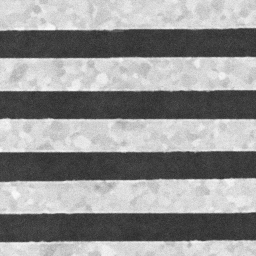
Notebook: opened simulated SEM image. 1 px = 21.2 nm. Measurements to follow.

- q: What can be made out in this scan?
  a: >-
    lines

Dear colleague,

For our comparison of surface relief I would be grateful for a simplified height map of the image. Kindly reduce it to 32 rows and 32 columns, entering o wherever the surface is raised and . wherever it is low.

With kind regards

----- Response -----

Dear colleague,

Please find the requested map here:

oooooooooooooooooooooooooooooooo
oooooooooooooooooooooooooooooooo
oooooooooooooooooooooooooooooooo
oooooooooooooooooooooooooooooo..
................................
................................
................................
oooooooooooooooooooooooooooooooo
oooooooooooooooooooooooooooooooo
oooooooooooooooooooooooooooooooo
oooooooooooooooooooooooooooooooo
................................
................................
................................
................................
oooooooooooooooooooooooooooooooo
oooooooooooooooooooooooooooooooo
oooooooooooooooooooooooooooooooo
oooooooooooooooooooooooooooooooo
................................
................................
................................
............................oooo
oooooooooooooooooooooooooooooooo
oooooooooooooooooooooooooooooooo
oooooooooooooooooooooooooooooooo
ooooooooooooooooooooooooooooooo.
................................
................................
................................
oooooooooooooooooooooooooooooooo
oooooooooooooooooooooooooooooooo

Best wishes